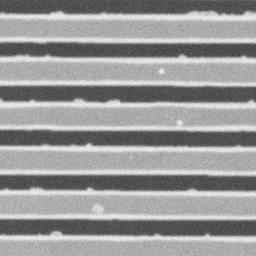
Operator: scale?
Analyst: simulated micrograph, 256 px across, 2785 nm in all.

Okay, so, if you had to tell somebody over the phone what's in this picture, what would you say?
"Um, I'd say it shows lines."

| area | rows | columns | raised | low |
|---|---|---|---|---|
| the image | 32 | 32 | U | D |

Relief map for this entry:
DDDDDDDDDDDDDDDDDDDDDDDDDDDDDDDD
DDDDDDDDDDDDDDDDDDDDDDDDDDDDDDDD
UUUUUUUUUUUUUUUUUUUUUUUUUUUUUUUU
UUUUUUUUUUUUUUUUUUUUUUUUUUUUUUUU
UUUUUUUUUUUUUUUUUUUUUUUUUUUUUUUU
DDDDDDDDDDDDDDDDDDDDDDDDDDDDDDDD
DDDDDDDDDDDDDDDDDDDDDDDDDDDDDDDD
UUUUUUUUUUUUUUUUDDDDUUDDDDUUDUUD
UUUUUUUUUUUUUUUUUUUUUUUUUUUUUUUU
UUUUUUUUUUUUUUUUUUUUUUUUUUUUUUUU
DDDDDDDDDDDDDDDDDDDDDDUUUUUUUUUU
DDDDDDDDDDDDDDDDDDDDDDDDDDDDDDDD
DDDDDDDDDDDDDDDDDDDDDDDDDDDDDDDD
UUUUUUUUUUUUUUUUUUUUUUUUUUUUUUUU
UUUUUUUUUUUUUUUUUUUUUUUUUUUUUUUU
UUUUUUUUUUUUUUUUUUUUUUUUUUUUUUUU
DDDDDDDDDDDDDDDDDDDDDDDDDDDDDDDD
DDDDDDDDDDDDDDDDDDDDDDDDDDDDDDDD
UUUUUUUUUUDDDDDDDDDDDDDDDDDDDDDD
UUUUUUUUUUUUUUUUUUUUUUUUUUUUUUUU
UUUUUUUUUUUUUUUUUUUUUUUUUUUUUUUU
UUUUUUUUUUUUUUUUUUUUUUUUUUUUUUUU
DDDDDDDDDDDDDDDDDDDDDDDDDDDDDDDD
DDDDDDDDDDDDDDDDDDDDDDDDDDDDDDDD
UUUUUUUUUUUUUUUUUUUUUUUUUUUUUUUU
UUUUUUUUUUUUUUUUUUUUUUUUUUUUUUUU
UUUUUUUUUUUUUUUUUUUUUUUUUUUUUUUU
DDDDDDDDDDDDDDDDDDDDDDDDDDDDDDDD
DDDDDDDDDDDDDDDDDDDDDDDDDDDDDDDD
DDDDDDDDDDDDDDDDDDDDDDDDDDDDDDDD
UUUUUUUUUUUUUUUUUUUUUUUUUUUUUUUU
UUUUUUUUUUUUUUUUUUUUUUUUUUUUUUUU